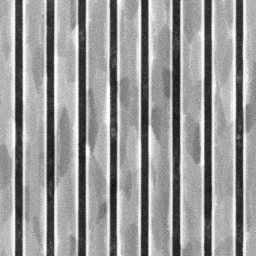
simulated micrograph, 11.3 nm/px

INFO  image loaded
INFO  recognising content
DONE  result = parallel lines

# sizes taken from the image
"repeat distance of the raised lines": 355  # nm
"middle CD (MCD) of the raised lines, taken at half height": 250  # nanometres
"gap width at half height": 106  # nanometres